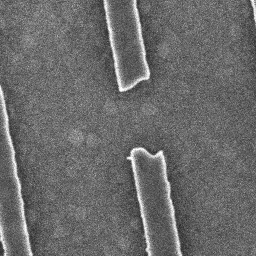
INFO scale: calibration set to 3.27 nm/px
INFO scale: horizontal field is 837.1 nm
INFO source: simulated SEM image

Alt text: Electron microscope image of one or a few lines or trenches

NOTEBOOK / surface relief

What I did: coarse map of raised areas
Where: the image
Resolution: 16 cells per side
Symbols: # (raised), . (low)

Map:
.......##.......
.......##.......
.......##.......
.......##.......
.......##.......
................
................
................
#...............
#.......#.......
#.......##......
#.......###.....
#........##.....
##.......##.....
##.......##.....
##.......##.....